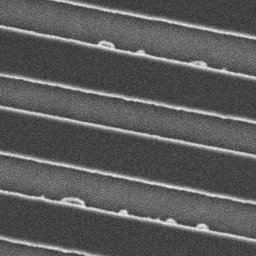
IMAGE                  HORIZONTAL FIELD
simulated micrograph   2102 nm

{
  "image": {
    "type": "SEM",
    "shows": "lines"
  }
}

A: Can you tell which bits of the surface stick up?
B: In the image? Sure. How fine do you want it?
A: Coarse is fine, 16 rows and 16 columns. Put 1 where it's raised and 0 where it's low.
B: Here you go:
0000001111111111
0000000000011111
1111100000000000
1111111110000000
1111111111111100
0000111111111111
0000000001111111
1111100000000001
1111111111000000
1111111111111110
0000011111111111
0000000000111111
1110000000000001
1111111100000000
1111111111111000
0001111111111111